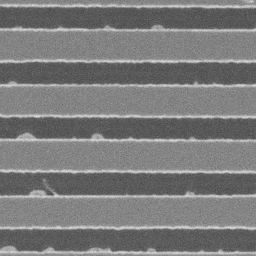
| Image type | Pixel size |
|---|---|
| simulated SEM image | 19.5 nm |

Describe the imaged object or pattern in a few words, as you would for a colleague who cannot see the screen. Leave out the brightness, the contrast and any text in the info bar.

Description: lines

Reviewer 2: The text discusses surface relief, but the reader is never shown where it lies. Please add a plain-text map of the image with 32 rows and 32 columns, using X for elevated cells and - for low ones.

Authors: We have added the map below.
XXXXXXXXXXXXXXXXXXXXXXXXXXXXXXXX
--------------------------------
--------------------------------
--------------------------------
XXXXXXXXXXXXXXXXXXXXXXXXXXXXXXXX
XXXXXXXXXXXXXXXXXXXXXXXXXXXXXXXX
XXXXXXXXXXXXXXXXXXXXXXXXXXXXXXXX
XXXXXXXXXXXXXXXXXXXXXXXXXXXXXXXX
--------------------------------
--------------------------------
--------------------------------
XXXXXXXXXXXXXXXXXXXXXXXXXXXXXXXX
XXXXXXXXXXXXXXXXXXXXXXXXXXXXXXXX
XXXXXXXXXXXXXXXXXXXXXXXXXXXXXXXX
XXXXXXXXXXXXXXXXXXXXXXXXXXXXXXXX
--------------------------------
--------------------------------
XXXXXXXXXXXXXXXXXXXXXXXXX-XXX---
XXXXXXXXXXXXXXXXXXXXXXXXXXXXXXXX
XXXXXXXXXXXXXXXXXXXXXXXXXXXXXXXX
XXXXXXXXXXXXXXXXXXXXXXXXXXXXXXXX
---------X----------XXX-XXXXXXXX
--------------------------------
--------------------------------
------XX-----------X---XXXX--XXX
XXXXXXXXXXXXXXXXXXXXXXXXXXXXXXXX
XXXXXXXXXXXXXXXXXXXXXXXXXXXXXXXX
XXXXXXXXXXXXXXXXXXXXXXXXXXXXXXXX
XXXXXXXXXXXXXXXXXXX--XXXXXXXXXXX
--------------------------------
--------------------------------
XXXXXXXXXXXXXXXXXX-----X-----X--